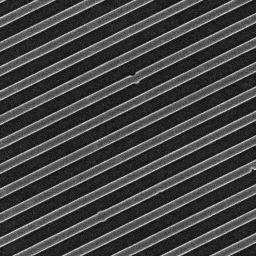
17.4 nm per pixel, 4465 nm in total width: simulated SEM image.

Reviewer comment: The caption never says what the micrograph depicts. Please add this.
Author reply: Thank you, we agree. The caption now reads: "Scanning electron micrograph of parallel lines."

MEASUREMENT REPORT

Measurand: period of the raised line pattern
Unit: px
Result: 21.9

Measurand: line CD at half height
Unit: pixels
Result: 8.62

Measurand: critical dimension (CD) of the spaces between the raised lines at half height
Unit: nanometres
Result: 240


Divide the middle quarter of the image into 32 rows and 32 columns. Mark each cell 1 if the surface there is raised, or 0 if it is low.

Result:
10000000011110000000011111000000
00000001111000000001111100000000
00000111100000000011110000000011
00011110000000011111000000001111
01111000000001111110000000111100
11100000000111110000000111110000
10000000011111000000011111000000
00000001111100000001111100000000
00000111110000000111110000000011
00011111000000011111000000001111
01111100000001111100000000111100
11110000000111110000000011110000
11000000011111000000001111000000
00000001111100000000111100000000
00000111110000000011111000000011
00011111000000001111000000001111
01111100000000111100000000111110
11110000000011111000000011111000
11000000001111000000001111100000
00000000111100000000111110000000
00000011110000000011111000000001
00001111000000001111100000000111
00111100000000111110000000011110
11110000000011111000000001111000
11000000001111100000001111100000
00000000111110000000011110000000
00000011111000000001111000000001
00001111100000000111100000000111
00111110000000111110000000011110
11111000000011111000000001111000
11100000001111100000000111100000
00000000111110000000011110000000